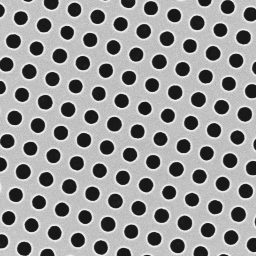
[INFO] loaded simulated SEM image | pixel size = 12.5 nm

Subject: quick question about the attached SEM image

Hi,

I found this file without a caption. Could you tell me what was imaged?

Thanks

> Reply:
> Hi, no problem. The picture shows a regular array of holes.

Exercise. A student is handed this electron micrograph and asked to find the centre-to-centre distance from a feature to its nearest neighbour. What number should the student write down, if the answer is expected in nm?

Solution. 301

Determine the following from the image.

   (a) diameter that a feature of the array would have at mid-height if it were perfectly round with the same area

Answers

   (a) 183 nm